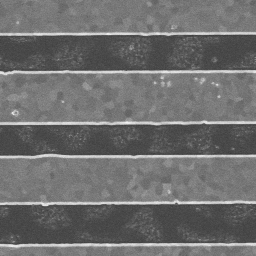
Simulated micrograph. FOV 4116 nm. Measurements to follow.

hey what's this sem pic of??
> one or a few lines or trenches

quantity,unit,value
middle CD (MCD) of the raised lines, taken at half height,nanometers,796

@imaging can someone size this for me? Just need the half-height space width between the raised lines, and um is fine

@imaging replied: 0.611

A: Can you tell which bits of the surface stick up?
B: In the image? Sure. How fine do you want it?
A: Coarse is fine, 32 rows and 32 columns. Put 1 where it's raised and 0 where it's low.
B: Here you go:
11111111111111111111111111111111
11111111111111111111111111111111
11111111111111111111111111111111
11111111111111111111111111111111
00000000000000000000000000000000
00000000000000000000000000000000
00000000000000000000000000000000
00000000000000000000000000000000
00000000000000000000000000000000
11111111111111111111111111111111
11111111111111111111111111111111
11111111111111111111111111111111
11111111111111111111111111111111
11111111111111111111111111111111
11111111111111111111111111111111
00000000000011100000000000000000
00000000000000000000000000000000
00000000000000000000000000000000
00000000000000000000000000000000
00000111000000000011001100010000
11111111111111111111111111111111
11111111111111111111111111111111
11111111111111111111111111111111
11111111111111111111111111111111
11111111111111111111111111111111
00000100000000000000000000000000
00000000000000000000000000000000
00000000000000000000000000000000
00000000000000000000000000000000
00000000000000000000000000000000
00000000000000000000000000000000
11111111111111111111111111111111